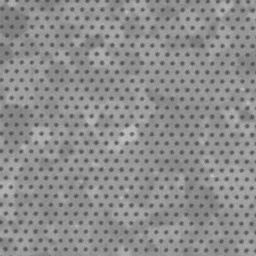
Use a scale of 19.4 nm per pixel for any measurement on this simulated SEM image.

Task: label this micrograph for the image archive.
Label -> a regular array of holes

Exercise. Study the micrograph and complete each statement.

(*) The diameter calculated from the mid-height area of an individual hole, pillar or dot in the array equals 5.3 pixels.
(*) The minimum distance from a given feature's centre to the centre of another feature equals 192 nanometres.